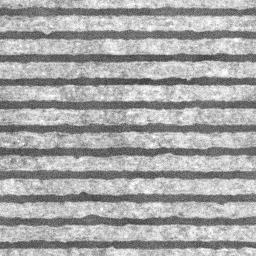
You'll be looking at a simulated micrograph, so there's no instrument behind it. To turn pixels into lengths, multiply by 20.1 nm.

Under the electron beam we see parallel lines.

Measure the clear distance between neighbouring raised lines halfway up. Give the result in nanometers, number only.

175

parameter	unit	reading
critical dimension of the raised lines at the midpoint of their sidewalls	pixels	14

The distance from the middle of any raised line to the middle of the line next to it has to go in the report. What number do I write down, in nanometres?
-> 468